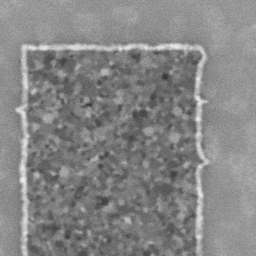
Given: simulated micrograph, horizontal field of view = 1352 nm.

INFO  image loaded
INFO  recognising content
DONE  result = one or a few lines or trenches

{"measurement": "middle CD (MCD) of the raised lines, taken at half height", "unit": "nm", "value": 925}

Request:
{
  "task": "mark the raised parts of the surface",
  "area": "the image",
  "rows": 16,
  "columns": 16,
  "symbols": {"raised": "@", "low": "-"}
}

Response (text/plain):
----------------
----------------
----------------
-@@@@@@@@@@@@---
--@@@@@@@@@@----
--@@@@@@@@@@----
-@@@@@@@@@@@----
-@@@@@@@@@@@----
--@@@@@@@@@@----
--@@@@@@@@@@@---
-@@@@@@@@@@@@---
--@@@@@@@@@@----
--@@@@@@@@@@@---
--@@@@@@@@@@----
--@@@@@@@@@@----
--@@@@@@@@@@----